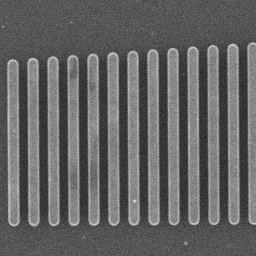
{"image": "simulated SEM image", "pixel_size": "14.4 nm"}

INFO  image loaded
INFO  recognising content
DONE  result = groups of lines, slits or small figures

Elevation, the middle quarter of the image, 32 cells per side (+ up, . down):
.++...++...++...++...+++..++...+
.++...++...++...++...+++..++...+
.++...++...++...++...+++..++...+
.++...++...++...++...+++..++...+
.++...++...++...++...+++..++...+
.++...+++..++...++...+++..++...+
.++...+++..++...+++..+++..++...+
.++...+++..++...+++..+++..+++..+
.++...+++..++...+++..+++..+++..+
.++...+++..++...+++..+++..+++..+
.++...+++..++...+++..+++..+++..+
.++...+++..++...+++..+++..+++..+
.++...+++..++...+++..+++..+++..+
.++...+++..++...+++..+++..+++..+
.++...+++..++...+++..+++..+++..+
.++...+++..++...+++..+++..+++..+
.++...+++..++...+++..+++..+++..+
.++...+++..++...+++..+++..+++..+
.++...+++..++...+++..+++..+++..+
.++...+++..++...+++..+++..+++..+
.++...+++..++...+++..+++..+++..+
.++...+++..++...+++..+++..+++..+
.++...+++..++...+++..+++..+++..+
.+++..+++..+++..+++..+++..+++..+
.+++..+++..+++..+++..+++..+++..+
.+++..+++..+++..+++..+++..+++..+
.+++..+++..+++..+++..+++..+++..+
.+++..+++..+++..+++..+++..+++..+
.+++..+++..+++..+++..+++..+++..+
.+++..+++..+++..+++..+++..+++..+
.+++..+++..+++..+++..+++..+++..+
.+++..+++..+++..+++..+++..+++..+